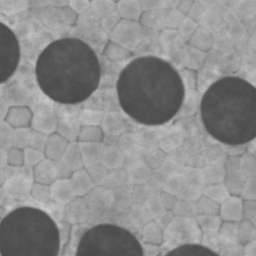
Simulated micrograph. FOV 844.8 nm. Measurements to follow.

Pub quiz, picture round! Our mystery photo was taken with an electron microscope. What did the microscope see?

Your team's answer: holes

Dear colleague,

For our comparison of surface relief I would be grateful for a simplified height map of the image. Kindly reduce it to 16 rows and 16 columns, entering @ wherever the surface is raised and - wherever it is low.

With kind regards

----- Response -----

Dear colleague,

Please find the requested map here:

@@@@@@@@@@@@@@@@
@@@@@@@@@@@@@@@@
-@@@-@@@@@@@@@@@
-@----@@@@@@@@@@
-@----@@---@@@@@
@@@---@----@@---
@@@@@@@@---@@---
@@@@@@@@---@@---
@@@@@@@@@@@@@---
@@@@@@@@@@@@@@@@
@@@@@@@@@@@@@@@@
@@@@@@@@@@@@@@@@
@@@@@@@@@@@@@@@@
---@@@@@@@@@@@@@
----@---@@@@@@@@
----@----@@--@@@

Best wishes